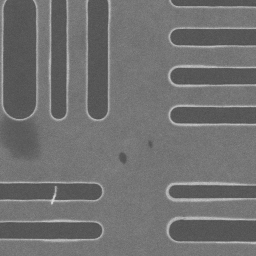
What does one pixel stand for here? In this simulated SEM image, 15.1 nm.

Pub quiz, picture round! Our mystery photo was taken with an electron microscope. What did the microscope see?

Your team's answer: groups of lines, slits or small figures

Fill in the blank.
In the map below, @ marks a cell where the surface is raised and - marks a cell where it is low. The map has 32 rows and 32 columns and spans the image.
@---@@--@@@---@@@@@@@@----------
-----@--@@@---@@@@@@@@@@@@@@@@@@
-----@--@@@---@@@@@@@@@@@@@@@@@@
-----@--@@@---@@@@@@@@@@@@@@@@@@
-----@--@@@---@@@@@@@-----------
-----@--@@@---@@@@@@@@----------
-----@--@@@---@@@@@@@@@@@@@@@@@@
-----@---@@---@@@@@@@@@@@@@@@@@@
-----@---@@---@@@@@@@@----------
-----@---@@---@@@@@@@-----------
-----@--@@@---@@@@@@@@----------
-----@--@@@---@@@@@@@@@@@@@@@@@@
-----@--@@@---@@@@@@@@@@@@@@@@@@
@---@@--@@@---@@@@@@@@----------
@---@@@-@@@--@@@@@@@@-----------
@@@@@@@@@@@@@@@@@@@@@@----------
@@@@@@@@@@@@@@@@@@@@@@@@@@@@@@@@
@@@@@@@@@@@@@@@@@@@@@@@@@@@@@@@@
@@@@@@@@@@@@@@@@@@@@@@@@@@@@@@@@
@@@@@@@@@@@@@@@@@@@@@@@@@@@@@@@@
@@@@@@@@@@@@@@@@@@@@@@@@@@@@@@@@
@@@@@@@@@@@@@@@@@@@@@@@@@@@@@@@@
@@@@@@@@@@@@@@@@@@@@@@@@@@@@@@@@
-------------@@@@@@@@-----------
-------------@@@@@@@@-----------
@@@@@@@@@@@@@@@@@@@@@@@@@@@@@@@@
@@@@@@@@@@@@@@@@@@@@@@@@@@@@@@@@
@@@@@@@@@@@@@@@@@@@@@@----------
-------------@@@@@@@@-----------
------------@@@@@@@@@-----------
@@@@@@@@@@@@@@@@@@@@@@@@@@@@@@@@
@@@@@@@@@@@@@@@@@@@@@@@@@@@@@@@@